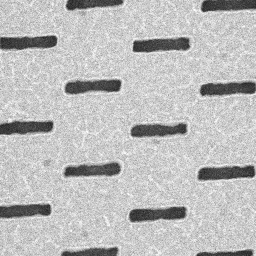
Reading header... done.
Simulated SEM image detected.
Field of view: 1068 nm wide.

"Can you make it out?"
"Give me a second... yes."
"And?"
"holes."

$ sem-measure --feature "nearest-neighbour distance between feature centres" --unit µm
0.326